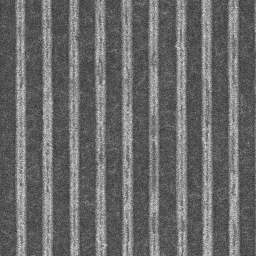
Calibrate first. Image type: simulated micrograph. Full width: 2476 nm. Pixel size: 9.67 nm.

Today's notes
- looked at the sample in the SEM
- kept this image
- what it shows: parallel lines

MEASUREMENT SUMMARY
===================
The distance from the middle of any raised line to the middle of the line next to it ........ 257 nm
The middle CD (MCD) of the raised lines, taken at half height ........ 0.0774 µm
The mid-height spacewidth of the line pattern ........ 0.173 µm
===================